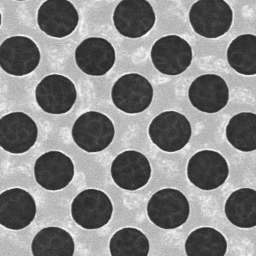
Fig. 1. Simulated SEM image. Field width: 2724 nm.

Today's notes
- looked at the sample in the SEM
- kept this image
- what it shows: a regular array of holes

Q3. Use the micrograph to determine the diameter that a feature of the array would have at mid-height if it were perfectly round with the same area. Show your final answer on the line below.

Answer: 435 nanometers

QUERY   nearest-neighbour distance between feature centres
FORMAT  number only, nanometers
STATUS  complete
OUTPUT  570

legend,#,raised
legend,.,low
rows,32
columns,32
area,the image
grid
#####....######....#####....####
#####.....####.....#####.....###
#####.....####.....#####.....###
#####....######....#####.....###
##.###..########..###.###...##..
....######....#####.....#####...
.....####.....#####.....####....
.....####.....#####.....####....
....######....#####....######...
######..#######...#######..#####
#####....#####.....#####....####
####......####.....#####.....###
#####....#####.....#####.....###
#####....######...#######...####
#...######...#######...######...
....#####.....#####.....####....
.....####.....#####.....####....
.....####.....#####.....####....
....######...#######...######...
#####...#######...######....####
####.....#####.....####.....####
####.....#####.....####......###
#####....#####.....#####....####
######..#######..########..#####
....######...######....######...
....#####.....####......####....
....#####.....####......####....
....#####.....#####....######...
#..###.###..####.###..###..###.#
####.....#####....######....####
####.....#####.....####.....####
####.....#####.....####.....####